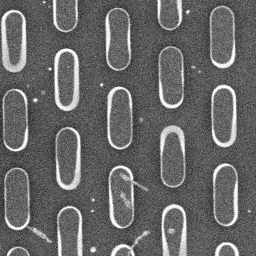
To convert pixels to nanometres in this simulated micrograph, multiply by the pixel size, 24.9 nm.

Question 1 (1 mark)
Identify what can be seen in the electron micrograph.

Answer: groups of lines, slits or small figures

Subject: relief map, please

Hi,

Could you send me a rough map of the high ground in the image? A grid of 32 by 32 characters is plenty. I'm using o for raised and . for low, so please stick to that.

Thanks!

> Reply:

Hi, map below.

.......ooo..........oo..........
.o.....ooo....oo....oo.....oo...
ooo....ooo...ooo....oo....ooo...
ooo....oo.....oo.....o....ooo...
.oo...........oo..........ooo...
.oo...........oo..........ooo...
.oo.....o....ooo....oo....ooo...
.oo....ooo...ooo....ooo....oo...
.o.....ooo....oo....ooo.........
.......ooo..........ooo.........
.......ooo..........ooo.........
.oo....ooo....oo....ooo....oo...
ooo....oo.....oo....ooo....oo...
ooo...........oo...........oo...
ooo...........oo...........oo...
.oo...........oo...........oo...
.oo....oo.....oo.....o.....oo...
.oo....ooo....oo....ooo....oo...
.oo....ooo..........ooo.........
.......ooo..........ooo.........
.......ooo..........ooo.........
.oo....ooo....oo....ooo....oo...
.oo....ooo....ooo...ooo....ooo..
.ooo..........oo...........ooo..
.ooo..........oo...........oo...
.ooo..........ooo..........oo...
.ooo....oo....ooo....oo....oo...
.ooo...ooo....oo....ooo....oo...
..o....ooo..........ooo.........
.......ooo..........ooo.........
........oo...........oo.........
.oo.....oo....ooo....oo....ooo..